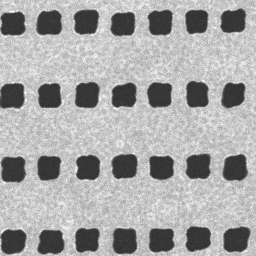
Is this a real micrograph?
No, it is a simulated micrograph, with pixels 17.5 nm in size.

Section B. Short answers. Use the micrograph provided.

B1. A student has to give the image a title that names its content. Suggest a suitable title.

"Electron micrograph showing a regular array of holes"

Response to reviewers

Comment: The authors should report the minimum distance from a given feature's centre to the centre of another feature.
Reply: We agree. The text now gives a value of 636 nanometres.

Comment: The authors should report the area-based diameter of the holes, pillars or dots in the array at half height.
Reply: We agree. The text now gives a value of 459 nm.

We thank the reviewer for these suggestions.